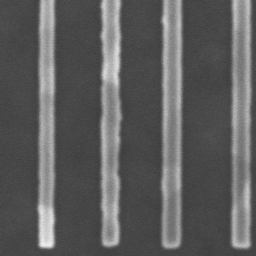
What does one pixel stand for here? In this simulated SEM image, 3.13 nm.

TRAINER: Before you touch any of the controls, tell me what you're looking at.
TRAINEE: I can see one or a few lines or trenches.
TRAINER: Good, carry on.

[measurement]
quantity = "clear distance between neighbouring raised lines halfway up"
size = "156 nanometers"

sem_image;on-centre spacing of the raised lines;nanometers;203